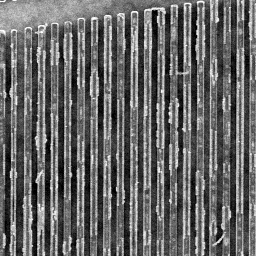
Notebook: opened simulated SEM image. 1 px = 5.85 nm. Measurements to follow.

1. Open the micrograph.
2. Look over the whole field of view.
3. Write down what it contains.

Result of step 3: parallel lines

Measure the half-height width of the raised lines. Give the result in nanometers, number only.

40.2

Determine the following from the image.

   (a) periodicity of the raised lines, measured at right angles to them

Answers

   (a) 77.9 nm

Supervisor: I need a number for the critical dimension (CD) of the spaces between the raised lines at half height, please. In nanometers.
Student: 35.1